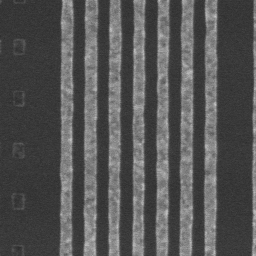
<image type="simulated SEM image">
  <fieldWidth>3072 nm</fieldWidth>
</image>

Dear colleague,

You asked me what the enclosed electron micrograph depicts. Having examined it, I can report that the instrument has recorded wiring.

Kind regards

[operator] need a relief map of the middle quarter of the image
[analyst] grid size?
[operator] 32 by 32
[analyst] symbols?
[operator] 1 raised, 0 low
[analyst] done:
11000111000011000011000011000011
11000111000011000011000011000011
11000111000011000011000011000011
11000111000011000011000011000011
11000111000111000011000111000011
11000111000111000011000111000011
11000111000111000011000111000111
11000111000111000111000111000111
11000111000111000111000011000011
11000111000111000111000011000011
11000111000111000111000011000011
11000111000111000011000111000011
11000111000111000011000111000011
11000111000111000111000111000111
11000111000111000111000111000111
11000111000011000111000111000111
11000111000011000111000111000111
11000111000011000111000111000111
11000111000011000111000111000111
11000111000011000111000111000111
11000111000111000011000111000111
11000111000111000111000111000111
11000111000111000111000111000111
11000111000111000111000111000111
11000111000111000011000111000111
11000111000111000111000111000111
11000111000111000111000111000111
11000111000111000111000111000111
11000111000011000111000111000111
11000111000111000111000111000111
11000111000111000111000111000111
11000111000111000111000111000111